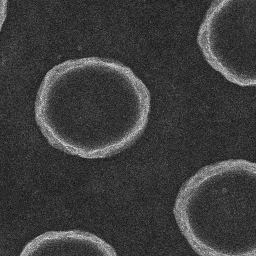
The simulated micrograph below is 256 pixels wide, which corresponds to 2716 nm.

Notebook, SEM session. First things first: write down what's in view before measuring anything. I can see raised bodies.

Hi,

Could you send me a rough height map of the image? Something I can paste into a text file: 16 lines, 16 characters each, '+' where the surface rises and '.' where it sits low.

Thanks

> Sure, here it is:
..............++
.............+++
.............+++
.............+++
...+++++......++
...++++++.......
...++++++.......
...++++++.......
...+++++........
.....+..........
..............++
............++++
...........+++++
...........+++++
............++++
..+++++......+++